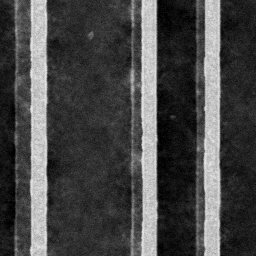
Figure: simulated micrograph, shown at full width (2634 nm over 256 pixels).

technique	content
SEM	lines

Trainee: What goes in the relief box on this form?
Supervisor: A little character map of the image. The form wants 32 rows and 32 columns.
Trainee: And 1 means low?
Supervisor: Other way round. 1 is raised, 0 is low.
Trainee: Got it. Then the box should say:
00111100000000000110000001100000
00111100000000000110000001100000
00111100000000000110000001100000
00111100000000000111000001100000
00111100000000000111000001100000
00111100000000000110000001100000
00111100000000000110000001100000
00111100000000000110000001100000
00111100000000000110000001100000
00111100000000000110000001100000
00111100000000000110000001100000
00111100000000000110000001100000
00111100000000000110000001100000
00111100000000000110000001100000
00111100000000000110000001100000
00111100000000000110000001100000
00111100000000000111000001100000
00111100000000000111000001100000
00111100000000000110000001100000
00111100000000000110000001100000
00111100000000000110000001100000
00111100000000000110000001100000
00111100000000000110000001100000
00111100000000000111000001100000
00111100000000000111000001100000
00111100000000000111000001100000
00111100000000000111000001100000
00111100000000000111000001100000
00111100000000000111000001100000
00111100000000000110000001100000
00111100000000000110000001100000
00111100000000000110000001100000